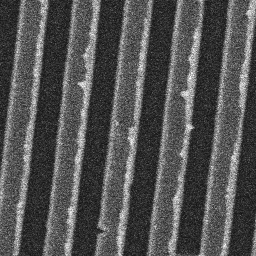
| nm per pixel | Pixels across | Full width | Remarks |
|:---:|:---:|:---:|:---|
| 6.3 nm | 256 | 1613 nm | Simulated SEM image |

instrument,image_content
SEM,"parallel lines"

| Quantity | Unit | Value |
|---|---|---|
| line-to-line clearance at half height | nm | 163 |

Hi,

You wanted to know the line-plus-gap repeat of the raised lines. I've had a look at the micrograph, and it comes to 326 nm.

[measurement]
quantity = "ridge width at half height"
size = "163 nm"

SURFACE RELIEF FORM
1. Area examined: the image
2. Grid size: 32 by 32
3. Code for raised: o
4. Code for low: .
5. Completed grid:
...ooo...ooo....ooo...ooo....ooo
...ooo...ooo....ooo...ooo....ooo
...ooo...ooo....ooo...ooo....ooo
..oooo...ooo...oooo...ooo....ooo
..ooo....ooo...ooo....ooo...ooo.
..ooo....ooo...ooo....ooo...ooo.
..ooo....ooo...ooo....ooo...ooo.
..ooo...oooo...ooo...oooo...ooo.
..ooo...oooo...ooo...ooo....ooo.
..ooo...ooo....ooo...ooo....ooo.
..ooo...ooo...oooo...ooo....ooo.
.oooo...ooo...oooo...ooo...oooo.
.oooo...ooo...oooo...ooo...oooo.
.ooo....ooo...ooo....ooo...ooo..
.ooo....ooo...ooo....ooo...ooo..
.ooo...oooo...ooo...oooo...ooo..
.ooo...oooo...ooo...oooo...ooo..
.ooo...ooo....ooo...ooo....ooo..
.ooo...ooo....ooo...ooo....ooo..
oooo...ooo....ooo...ooo....ooo..
oooo...ooo...oooo...ooo...oooo..
ooo....ooo...ooo....ooo...ooo...
ooo....ooo...ooo....ooo...ooo...
ooo....ooo...ooo....ooo...ooo...
ooo...oooo...ooo...oooo...ooo...
ooo...ooo....ooo...oooo...ooo...
ooo...ooo....ooo...ooo....ooo...
ooo...ooo....ooo...ooo....ooo...
ooo...ooo....ooo...ooo...oooo...
ooo...ooo...oooo...ooo...oooo...
oo....ooo...ooo....ooo...ooo....
oo....ooo...ooo....ooo...ooo....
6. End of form